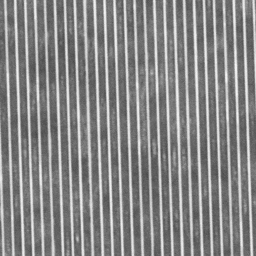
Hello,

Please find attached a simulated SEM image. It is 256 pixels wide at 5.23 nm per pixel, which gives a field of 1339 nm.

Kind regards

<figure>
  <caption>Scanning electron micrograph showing parallel lines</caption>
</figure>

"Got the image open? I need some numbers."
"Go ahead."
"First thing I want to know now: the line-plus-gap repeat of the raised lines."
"0.0519 microns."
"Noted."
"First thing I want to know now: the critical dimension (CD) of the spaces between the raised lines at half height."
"43.2 nanometers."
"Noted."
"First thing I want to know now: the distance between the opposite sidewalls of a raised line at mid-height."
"9.8 nm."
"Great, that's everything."